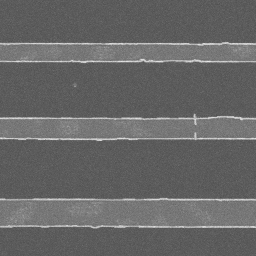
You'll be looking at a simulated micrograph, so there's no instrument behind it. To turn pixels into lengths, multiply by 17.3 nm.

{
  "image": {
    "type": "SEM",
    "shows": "one or a few lines or trenches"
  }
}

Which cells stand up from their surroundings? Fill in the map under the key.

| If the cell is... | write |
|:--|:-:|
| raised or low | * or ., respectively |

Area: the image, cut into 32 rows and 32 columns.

********************************
********************************
********************************
********************************
********************************
**.....**..*******...*******.***
................................
........................*.......
********************************
********************************
********************************
********************************
********************************
********************************
********************************
................................
................................
********************************
********************************
********************************
********************************
********************************
********************************
********************************
********************************
................................
................................
................................
********************************
********************************
********************************
********************************